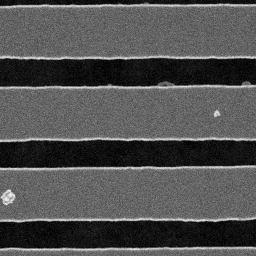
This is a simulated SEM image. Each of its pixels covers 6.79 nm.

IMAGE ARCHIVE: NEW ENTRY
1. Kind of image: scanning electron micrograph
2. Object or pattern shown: lines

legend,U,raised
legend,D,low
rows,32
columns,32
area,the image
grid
DDDDDDDDDDDDDDDDDDDDDDDDDDDUUDDD
UUUUUUUUUUUUUUUUUUUUUUUUUUUUUUUU
UUUUUUUUUUUUUUUUUUUUUUUUUUUUUUUU
UUUUUUUUUUUUUUUUUUUUUUUUUUUUUUUU
UUUUUUUUUUUUUUUUUUUUUUUUUUUUUUUU
UUUUUUUUUUUUUUUUUUUUUUUUUUUUUUUU
UUUUUUUUUUUUUUUUUUUUUUUUUUUUUUUU
DDDDDDDDDDDDDDDDDDDDDDDDDDDDDDDD
DDDDDDDDDDDDDDDDDDDDDDDDDDDDDDDD
DDDDDDDDDDDDDDDDDDDDDDDDDDDDDDDD
DDDDDDDDDDDDDDDDDDDDDDDDDDDDDDDD
UUUUUUUUUUUUUUUUUUUUUUUUUUUUUUUU
UUUUUUUUUUUUUUUUUUUUUUUUUUUUUUUU
UUUUUUUUUUUUUUUUUUUUUUUUUUUUUUUU
UUUUUUUUUUUUUUUUUUUUUUUUUUUUUUUU
UUUUUUUUUUUUUUUUUUUUUUUUUUUUUUUU
UUUUUUUUUUUUUUUUUUUUUUUUUUUUUUUU
UUUUDDDUUUUDDDDUUDUUDDUDDUDDDUDU
DDDDDDDDDDDDDDDDDDDDDDDDDDDDDDDD
DDDDDDDDDDDDDDDDDDDDDDDDDDDDDDDD
DDDDDDDDDDDDDDDDDDDDDDDDDDDDDDDD
UUUUUUUUUUUUUUUUUUUUUUUUUUUUUUUU
UUUUUUUUUUUUUUUUUUUUUUUUUUUUUUUU
UUUUUUUUUUUUUUUUUUUUUUUUUUUUUUUU
UUUUUUUUUUUUUUUUUUUUUUUUUUUUUUUU
UUUUUUUUUUUUUUUUUUUUUUUUUUUUUUUU
UUUUUUUUUUUUUUUUUUUUUUUUUUUUUUUU
UUUUUUUUUUUUUUUUUUDUUUUUUUUUUDUD
DDDDDDDDDDDDDDDDDDDDDDDDDDDDDDDD
DDDDDDDDDDDDDDDDDDDDDDDDDDDDDDDD
DDDDDDDDDDDDDDDDDDDDDDDDDDDDDDDD
UUUUUUUUUUUUUUUUUUUUUUUUUUUUUUUU